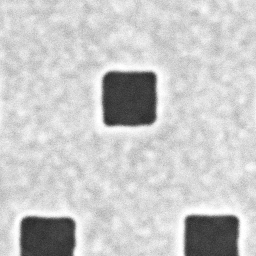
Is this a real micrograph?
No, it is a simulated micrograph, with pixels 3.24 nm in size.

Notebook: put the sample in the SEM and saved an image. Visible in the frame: holes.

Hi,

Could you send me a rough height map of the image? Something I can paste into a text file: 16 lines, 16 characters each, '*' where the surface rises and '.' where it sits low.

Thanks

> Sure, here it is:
****************
****************
****************
****************
*******..*******
******....******
******....******
******....******
****************
****************
****************
****************
****************
**.*********...*
*....******....*
*....******....*